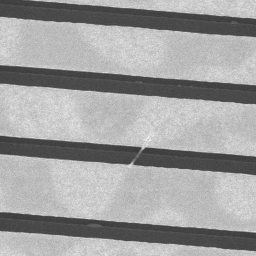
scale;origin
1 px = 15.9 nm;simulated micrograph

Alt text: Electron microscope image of lines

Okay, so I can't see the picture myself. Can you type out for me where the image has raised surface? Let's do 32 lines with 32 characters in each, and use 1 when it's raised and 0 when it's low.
00000000011111111111111111111111
00000000000000000000001111111111
11100000000000000000000000000000
11111111111111111000000000000000
11111111111111111111111111111100
11111111111111111111111111111111
11111111111111111111111111111111
11111111111111111111111111111111
00000111111111111111111111111111
00000000000000000111111111111111
00000000000000000000000000000011
11111111111100000000000000000000
11111111111111111111111100000000
11111111111111111111111111111111
11111111111111111111111111111111
11111111111111111111111111111111
11111111111111111111111111111111
00000001111111111111111111111111
00000000000000000001111111111111
11000000000000000000000000000001
11111111111111001000000000000000
11111111111111111111111111100000
11111111111111111111111111111111
11111111111111111111111111111111
11111111111111111111111111111111
11111111111111111111111111111111
01111111111111111111111111111111
00000000000001111111111111111111
00000000000000000000000001111111
11111111000000000000000000000000
11111111111111111111100000000000
11111111111111111111111111111111